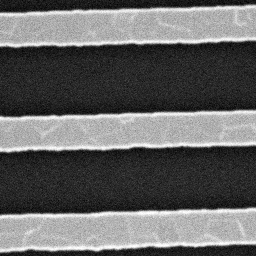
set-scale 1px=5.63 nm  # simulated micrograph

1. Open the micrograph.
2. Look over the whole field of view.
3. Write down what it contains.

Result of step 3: lines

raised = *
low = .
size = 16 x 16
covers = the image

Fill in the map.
............****
****************
****************
................
................
................
................
****************
****************
................
................
................
................
****************
****************
********........